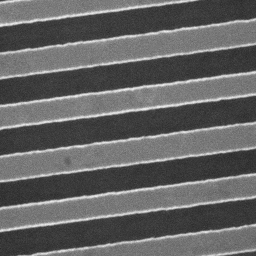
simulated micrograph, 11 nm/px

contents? lines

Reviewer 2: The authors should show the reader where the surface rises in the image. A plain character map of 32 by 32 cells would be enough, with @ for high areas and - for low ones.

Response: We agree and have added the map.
@@@@@@@@@@@@@@@@@@@@@-----------
@@@@@@@@@@@@@@------------------
@@@@@@-------------------------@
-----------------------@@@@@@@@@
---------------@@@@@@@@@@@@@@@@@
---------@@@@@@@@@@@@@@@@@@@@@@@
-@@@@@@@@@@@@@@@@@@@@@@@@-------
@@@@@@@@@@@@@@@@@@--------------
@@@@@@@@@@----------------------
@@@-------------------------@@@@
--------------------@@@@@@@@@@@@
-------------@@@@@@@@@@@@@@@@@@@
-----@@@@@@@@@@@@@@@@@@@@@@-----
@@@@@@@@@@@@@@@@@@@@------------
@@@@@@@@@@@@--------------------
@@@@@-------------------------@@
----------------------@@@@@@@@@@
----------------@@@@@@@@@@@@@@@@
-------@@@@@@@@@@@@@@@@@@@@@@@@@
@@@@@@@@@@@@@@@@@@@@@@@@@-------
@@@@@@@@@@@@@@@@@---------------
@@@@@@@@@@----------------------
@@------------------------@@@@@@
-------------------@@@@@@@@@@@@@
-----------@@@@@@@@@@@@@@@@@@@@@
---@@@@@@@@@@@@@@@@@@@@@@@------
@@@@@@@@@@@@@@@@@@--------------
@@@@@@@@@@@---------------------
@@@--------------------------@@@
---------------------@@@@@@@@@@@
--------------@@@@@@@@@@@@@@@@@@
------@@@@@@@@@@@@@@@@@@@@@@@@@-